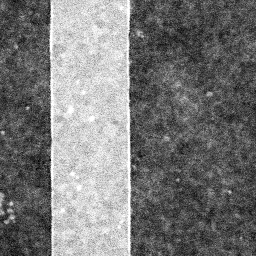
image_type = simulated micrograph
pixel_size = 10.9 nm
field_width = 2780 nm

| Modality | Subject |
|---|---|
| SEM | one or a few lines or trenches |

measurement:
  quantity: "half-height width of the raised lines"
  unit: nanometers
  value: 839